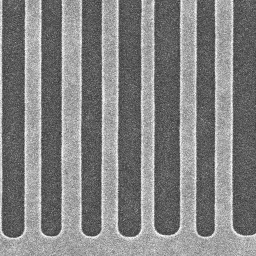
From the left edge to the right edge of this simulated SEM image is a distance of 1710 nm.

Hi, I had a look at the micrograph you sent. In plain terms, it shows parallel lines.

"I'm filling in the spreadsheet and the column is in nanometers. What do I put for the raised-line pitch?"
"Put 255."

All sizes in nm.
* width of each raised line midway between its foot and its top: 103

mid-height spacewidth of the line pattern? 0.146 microns